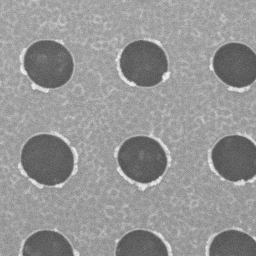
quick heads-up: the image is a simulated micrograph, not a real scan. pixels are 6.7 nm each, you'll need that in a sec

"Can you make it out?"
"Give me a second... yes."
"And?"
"holes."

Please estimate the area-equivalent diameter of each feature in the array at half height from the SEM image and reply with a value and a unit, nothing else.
331 nanometres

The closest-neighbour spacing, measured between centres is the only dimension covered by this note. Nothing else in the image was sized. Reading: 637 nm